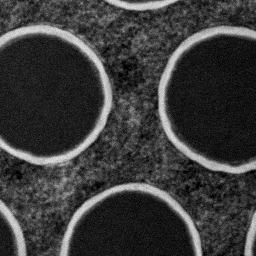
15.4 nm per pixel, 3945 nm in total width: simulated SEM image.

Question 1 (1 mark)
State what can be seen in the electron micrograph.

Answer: raised bodies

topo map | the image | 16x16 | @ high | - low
----------------
----------------
@@@@@-------@@@@
@@@@@@-----@@@@@
@@@@@@----@@@@@@
@@@@@@@---@@@@@@
@@@@@@@---@@@@@@
@@@@@@----@@@@@@
@@@@@@-----@@@@@
-@@@@-------@@@@
--------------@-
----------------
------@@@@@-----
@----@@@@@@@----
@---@@@@@@@@----
@---@@@@@@@@----